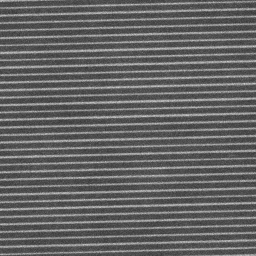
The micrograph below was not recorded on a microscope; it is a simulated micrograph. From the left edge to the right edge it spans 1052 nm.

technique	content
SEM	parallel lines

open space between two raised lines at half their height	5.89	pixels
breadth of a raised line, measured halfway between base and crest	4.1	nm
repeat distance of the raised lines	30.7	nanometres